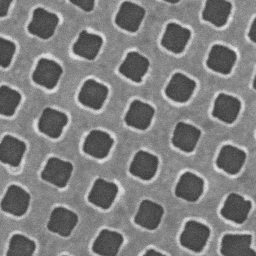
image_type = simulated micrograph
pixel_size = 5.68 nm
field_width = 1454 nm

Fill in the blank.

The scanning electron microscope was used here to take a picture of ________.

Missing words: a regular array of holes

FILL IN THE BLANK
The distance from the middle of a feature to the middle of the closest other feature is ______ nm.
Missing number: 279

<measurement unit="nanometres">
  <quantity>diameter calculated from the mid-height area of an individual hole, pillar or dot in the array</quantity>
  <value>168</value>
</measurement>